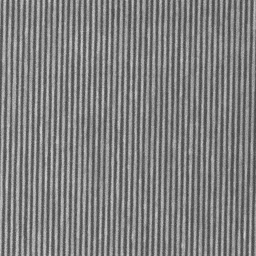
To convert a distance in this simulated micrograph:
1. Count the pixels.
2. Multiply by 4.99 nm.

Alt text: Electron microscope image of parallel lines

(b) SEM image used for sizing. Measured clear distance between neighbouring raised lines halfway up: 0.0175 micrometres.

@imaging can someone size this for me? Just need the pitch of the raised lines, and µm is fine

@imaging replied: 0.0277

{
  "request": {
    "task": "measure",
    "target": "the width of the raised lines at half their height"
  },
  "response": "0.0106 micrometres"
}